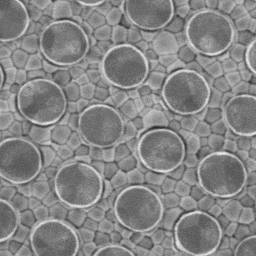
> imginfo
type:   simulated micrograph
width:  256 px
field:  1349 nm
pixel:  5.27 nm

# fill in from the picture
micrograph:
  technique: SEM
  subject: a regular array of raised bodies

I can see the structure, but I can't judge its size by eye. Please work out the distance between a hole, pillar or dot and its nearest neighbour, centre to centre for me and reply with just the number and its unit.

333 nanometers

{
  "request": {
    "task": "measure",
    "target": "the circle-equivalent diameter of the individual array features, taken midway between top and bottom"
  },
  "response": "240 nanometers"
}